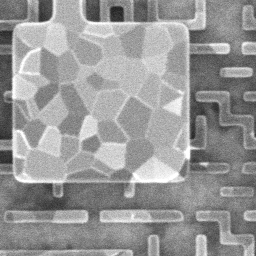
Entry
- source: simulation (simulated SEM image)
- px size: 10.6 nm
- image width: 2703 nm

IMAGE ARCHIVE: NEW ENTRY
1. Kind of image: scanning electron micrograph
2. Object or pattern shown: wiring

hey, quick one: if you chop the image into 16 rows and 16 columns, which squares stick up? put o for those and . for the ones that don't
...oo...........
.oooooooooo.....
.ooooooooooo....
.ooooooooooo....
.ooooooooooo....
.ooooooooooo....
.ooooooooooo....
.ooooooooooo....
.ooooooooooo....
.ooooooooooo....
.ooooooooooo....
................
................
................
................
................